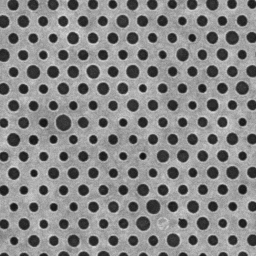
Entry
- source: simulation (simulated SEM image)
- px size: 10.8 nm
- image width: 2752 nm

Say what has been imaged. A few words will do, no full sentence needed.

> a regular array of holes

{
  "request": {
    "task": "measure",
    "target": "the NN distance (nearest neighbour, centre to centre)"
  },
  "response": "0.208 um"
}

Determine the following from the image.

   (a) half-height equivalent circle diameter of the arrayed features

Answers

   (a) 119 nanometers